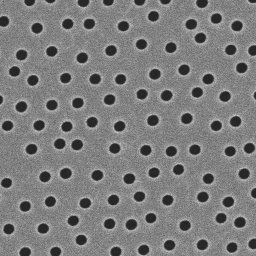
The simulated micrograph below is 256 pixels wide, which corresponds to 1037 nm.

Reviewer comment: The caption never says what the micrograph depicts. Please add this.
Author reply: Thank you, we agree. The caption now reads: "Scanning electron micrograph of a regular array of holes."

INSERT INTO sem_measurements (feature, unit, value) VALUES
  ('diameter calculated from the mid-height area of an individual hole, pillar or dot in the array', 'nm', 43.2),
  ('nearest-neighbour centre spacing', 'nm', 94.7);